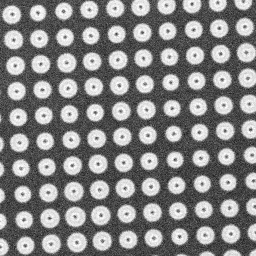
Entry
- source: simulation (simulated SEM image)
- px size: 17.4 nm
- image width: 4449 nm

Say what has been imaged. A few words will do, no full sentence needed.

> an array of small figures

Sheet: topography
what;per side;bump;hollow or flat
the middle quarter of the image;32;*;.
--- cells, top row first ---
***..****...***....*............
**..............................
................................
.............**....***...***...*
***...***...****..****...****..*
***..****...****..****...***....
***..****...****...***..........
***...***....*..................
................................
....................*.....**....
.......**....***...****..****...
***...****..****..*****..****...
***...****..****...****...**....
***...***....***....*...........
................................
................................
.............***...****...***...
***...****...****..****...***...
****..****...****..****...***...
****..****...***....**..........
***....**.......................
................................
....................**.....**...
.**....***...****..****...****..
****..*****..****..****...****..
****..*****..****...***....**...
****...***....**................
................................
...........................**...
........**....***...***...****..
.***...****..****...****..****..
*****..****..****...****..****..